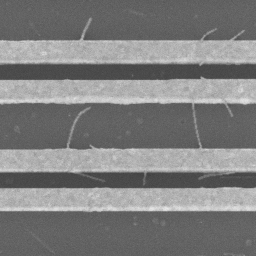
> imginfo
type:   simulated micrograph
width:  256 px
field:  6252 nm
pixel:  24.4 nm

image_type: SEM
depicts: lines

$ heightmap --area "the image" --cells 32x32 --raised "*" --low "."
................................
................................
................................
................................
................................
********************************
********************************
********************************
................................
................................
********************************
********************************
********************************
................................
................................
................................
................................
................................
........*.......................
********************************
********************************
.........*..................*...
................................
.......*...***...........*.*****
********************************
********************************
................................
................................
................................
................................
................................
................................